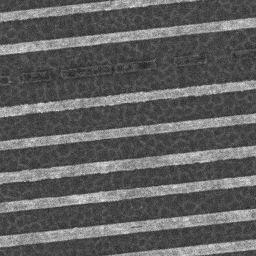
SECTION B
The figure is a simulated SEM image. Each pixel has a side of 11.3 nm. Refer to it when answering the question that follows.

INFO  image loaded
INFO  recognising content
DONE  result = parallel lines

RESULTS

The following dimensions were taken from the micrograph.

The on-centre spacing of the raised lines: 360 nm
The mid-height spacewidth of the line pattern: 268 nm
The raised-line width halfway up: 95.9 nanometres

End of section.